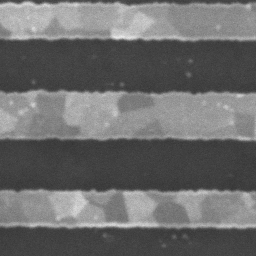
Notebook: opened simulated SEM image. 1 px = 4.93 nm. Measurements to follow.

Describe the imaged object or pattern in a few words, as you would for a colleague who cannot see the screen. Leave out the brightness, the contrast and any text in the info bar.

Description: lines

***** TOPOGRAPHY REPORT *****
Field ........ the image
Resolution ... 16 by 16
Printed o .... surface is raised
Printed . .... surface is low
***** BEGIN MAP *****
oooooooooooooooo
oooooooooooooooo
................
................
................
................
oooooooooooooooo
oooooooooooooooo
oooooooooooooooo
................
................
................
oooooooooooooooo
oooooooooooooooo
................
................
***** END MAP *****